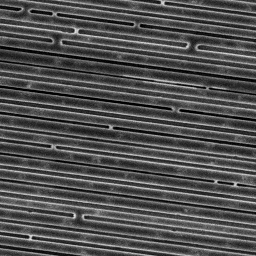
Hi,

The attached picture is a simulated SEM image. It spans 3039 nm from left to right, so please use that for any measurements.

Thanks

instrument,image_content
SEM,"parallel lines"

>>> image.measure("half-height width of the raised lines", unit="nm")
106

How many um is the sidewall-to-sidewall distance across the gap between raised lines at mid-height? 0.047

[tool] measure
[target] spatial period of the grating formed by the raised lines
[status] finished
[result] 156 nanometers